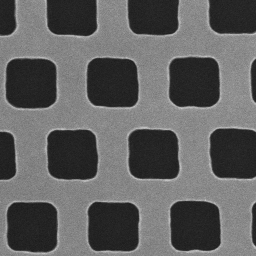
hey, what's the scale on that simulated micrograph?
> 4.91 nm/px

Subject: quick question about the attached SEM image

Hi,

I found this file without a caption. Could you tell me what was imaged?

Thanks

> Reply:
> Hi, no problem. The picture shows a regular array of holes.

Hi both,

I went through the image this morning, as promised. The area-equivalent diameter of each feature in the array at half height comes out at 269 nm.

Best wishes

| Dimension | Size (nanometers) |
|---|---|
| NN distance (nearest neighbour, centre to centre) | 399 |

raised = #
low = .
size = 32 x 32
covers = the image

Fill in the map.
..####......####......####......
..####......####......####......
..####......####......####......
..####......####......####......
.#########.########.############
################################
################################
##....#####.....######.....#####
#......####......####......####.
#......####......####......####.
#......####......####......####.
#......####......####.......###.
#......####......####......#####
###...##########################
################################
################################
.#####.....######.....#####.....
..####......####......####......
..####......####......####......
..####......####......####......
..####......####......####......
..####......####......#####.....
.###############################
################################
################################
##....######.....#####.....#####
#......####......####......####.
#......####......####......####.
#......####......####.......###.
#......####......####.......###.
#......####......####.......####
####..##########################